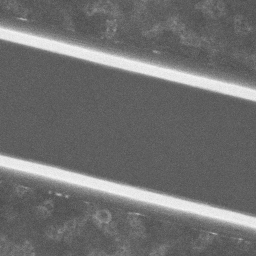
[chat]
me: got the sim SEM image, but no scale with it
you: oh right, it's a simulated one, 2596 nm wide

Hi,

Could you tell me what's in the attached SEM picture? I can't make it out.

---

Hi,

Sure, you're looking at one or a few lines or trenches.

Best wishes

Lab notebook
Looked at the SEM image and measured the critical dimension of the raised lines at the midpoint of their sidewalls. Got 1260 nanometres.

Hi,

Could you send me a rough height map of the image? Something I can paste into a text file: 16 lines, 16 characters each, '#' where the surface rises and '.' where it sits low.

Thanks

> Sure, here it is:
................
................
##..............
######..........
##########......
##############..
################
################
################
################
..##############
......##########
..........######
..............##
................
................